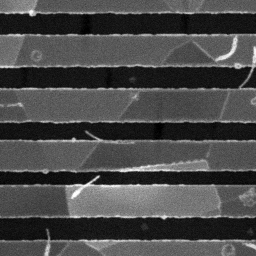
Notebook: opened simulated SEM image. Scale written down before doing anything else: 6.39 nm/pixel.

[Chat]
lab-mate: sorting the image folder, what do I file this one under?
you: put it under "lines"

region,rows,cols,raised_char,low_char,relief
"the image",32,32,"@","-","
@@@@@@@@@@@@@@@@@@@@@@@@@@@@@@@@
@@@@@@@@@@@@@@@@@@@@@@@@@@@@@@@@
--------------------------------
--------------------------------
@@@@@@@@@@@@@@@@@@@@@@@@@@@@@@@@
@@@@@@@@@@@@@@@@@@@@@@@@@@@@@@@@
@@@@@@@@@@@@@@@@@@@@@@@@@@@@@@@@
@@@@@@@@@@@@@@@@@@@@@@@@@@@@@@@@
-----------------------------@--
--------------------------------
--------------------------------
@@@@@@@@@@@@@@@@@@@@@@@@@@@@@@@@
@@@@@@@@@@@@@@@@@@@@@@@@@@@@@@@@
@@@@@@@@@@@@@@@@@@@@@@@@@@@@@@@@
@@@@@@@@@@@@@@@@@@@@@@@@@@@@@@@@
--------------------------------
--------------------------------
---------@--@-------------------
@@@@@@@@@@@@@@@@@@@@@@@@@@@@@@@@
@@@@@@@@@@@@@@@@@@@@@@@@@@@@@@@@
@@@@@@@@@@@@@@@@@@@@@@@@@@@@@@@@
-----@--------------------------
--------------------------------
@@@@@@@@@@@@@@@@@@@@@@@@@@@@@@@@
@@@@@@@@@@@@@@@@@@@@@@@@@@@@@@@@
@@@@@@@@@@@@@@@@@@@@@@@@@@@@@@@@
@@@@@@@@@@@@@@@@@@@@@@@@@@@@@@@@
--------------------------------
--------------------------------
--------------------------------
@@@@@@@@@@@@@@@@@@@@@@@@@@@@@@@@
@@@@@@@@@@@@@@@@@@@@@@@@@@@@@@@@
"